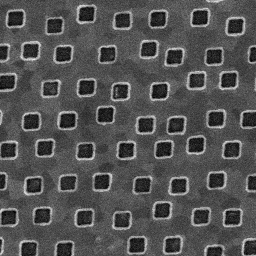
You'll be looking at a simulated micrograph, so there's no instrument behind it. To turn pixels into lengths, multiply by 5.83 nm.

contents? a regular array of holes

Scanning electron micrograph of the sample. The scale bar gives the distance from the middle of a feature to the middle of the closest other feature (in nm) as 184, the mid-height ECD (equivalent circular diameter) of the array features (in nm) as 102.